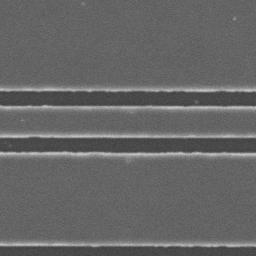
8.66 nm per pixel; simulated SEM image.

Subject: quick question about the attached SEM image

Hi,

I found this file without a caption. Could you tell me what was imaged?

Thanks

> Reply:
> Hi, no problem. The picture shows lines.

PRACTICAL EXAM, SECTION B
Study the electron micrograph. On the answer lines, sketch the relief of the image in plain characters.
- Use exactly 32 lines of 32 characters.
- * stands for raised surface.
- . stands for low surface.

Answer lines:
********************************
********************************
********************************
********************************
********************************
********************************
********************************
********************************
********************************
********************************
********************************
................................
................................
********************************
********************************
********************************
********************************
................................
................................
********************************
********************************
********************************
********************************
********************************
********************************
********************************
********************************
********************************
********************************
********************************
********************************
................................